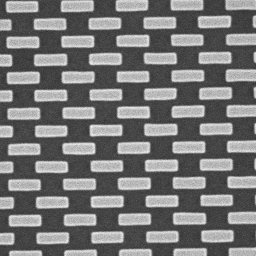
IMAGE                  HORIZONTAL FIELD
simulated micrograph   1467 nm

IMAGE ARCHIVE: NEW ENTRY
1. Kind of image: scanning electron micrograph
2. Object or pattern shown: groups of lines, slits or small figures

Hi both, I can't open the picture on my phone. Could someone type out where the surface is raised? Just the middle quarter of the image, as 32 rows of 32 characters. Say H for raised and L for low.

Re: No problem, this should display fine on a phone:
LLLLLLLLLLLLLLLLLLLLLLLLLLLLLLLL
LLLLLLLLLLLLLLLLLLLLLLLLLLLLLLLL
HHHHHHHLLLLLLHHHHHHHHLLLLLLHHHHH
HHHHHHHLLLLLLHHHHHHHHLLLLLLHHHHH
HHHHHHLLLLLLLLLLLLLLLLLLLLLLLLLL
LLLLLLLLLLLLLLLLLLLLLLLLLLLLLLLL
LLLLLLLHHHHHHHLLLLLLHHHHHHHHLLLL
HLLLLLLHHHHHHHLLLLLLHHHHHHHHLLLL
HLLLLLLHHHHHHHLLLLLLHHHHHHHHLLLL
LLLLLLLLLLLLLLLLLLLLLLLLLLLLLLLL
LLLLLLLLLLLLLLLLLLLLLLLLLLLLLLLL
HHHHHHHLLLLLLHHHHHHHHLLLLLLHHHHH
HHHHHHHHLLLLLHHHHHHHHLLLLLLHHHHH
HHHHHHHLLLLLLLHHHLLHHLLLLLLLLLLL
LLLLLLLLLLLLLLLLLLLLLLLLLLLLLLLL
LLLLLLLHHHHHHHLLLLLLHHHHHHHHLLLL
HLLLLLLHHHHHHHLLLLLLHHHHHHHHLLLL
HLLLLLLHHHHHHHLLLLLLHHHHHHHHLLLL
LLLLLLLLLLLLLLLLLLLLLLLLLLLLLLLL
LLLLLLLLLLLLLLLLLLLLLLLLLLLLLLHH
HHHHHHHHLLLLLLHHHHHHHLLLLLLHHHHH
HHHHHHHHLLLLLLHHHHHHHLLLLLLHHHHH
LLHHHHHLLLLLLLLLLLLLLLLLLLLLLLLL
LLLLLLLLLLLLLLLLLLLLLLLLLLLLLLLL
HLLLLLLHHHHHHHHLLLLLHHHHHHHHLLLL
HLLLLLLHHHHHHHHLLLLLHHHHHHHHLLLL
HLLLLLLHHHHHHHHLLLLLHHHHHHHHLLLL
LLLLLLLLLLLLLLLLLLLLLLLLLLLLLLLL
LLLLLLLLLLLLLLLLLLLLLLLLLLLHHHHH
HHHHHHHHLLLLLLHHHHHHHLLLLLLHHHHH
HHHHHHHHLLLLLLHHHHHHHLLLLLLHHHHH
LLLLLLLLLLLLLLLLLLLLLLLLLLLLLLLL